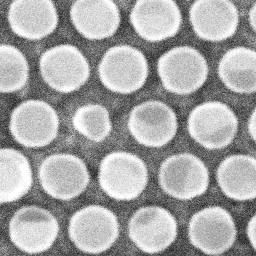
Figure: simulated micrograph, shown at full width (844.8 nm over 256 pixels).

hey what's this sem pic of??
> a regular array of raised bodies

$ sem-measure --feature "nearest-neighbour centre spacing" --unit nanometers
196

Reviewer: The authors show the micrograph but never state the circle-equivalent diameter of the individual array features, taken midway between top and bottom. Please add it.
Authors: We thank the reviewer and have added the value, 150 nanometres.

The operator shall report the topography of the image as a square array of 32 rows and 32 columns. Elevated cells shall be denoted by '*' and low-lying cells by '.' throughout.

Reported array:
..****...*****...*****..*****...
.******..******..*****..*****..*
.******..******..*****..******.*
..*****...*****..*****..*****...
...***.....**.....***....***....
................................
**....****....***....****....***
***..******..*****..*****...****
***..******..*****..******.*****
***..******..*****..******..****
***...****...*****...****...****
......................**......*.
................................
..****.....**....****....***....
..*****...****..******..*****...
.******..*****..******..*****..*
..*****...****...*****..*****..*
..****...........****....****...
................................
***....**.....**......**........
***..*****...*****...****...****
****.******..*****..******.*****
****.******..*****..******.*****
****..*****..*****..******..****
***....**.....***.....**.....***
................................
..****....***....****....***....
..*****..*****..******..*****...
.******..******.******..*****..*
..*****..*****..******..*****..*
..****....****...****...*****...
..........................**....